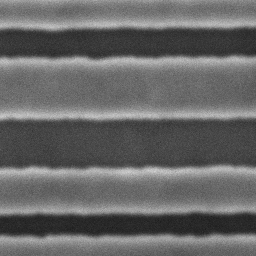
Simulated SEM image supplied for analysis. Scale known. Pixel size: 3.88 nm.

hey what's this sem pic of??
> lines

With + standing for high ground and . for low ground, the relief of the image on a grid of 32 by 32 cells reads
++++++++++++++++++++++++++++++++
++++++++++++++++++++++++++++++++
++++++++++++++++++++++++++++++++
....+++++.......................
................................
................................
................................
++++++.++++..+++++++++++++++++++
++++++++++++++++++++++++++++++++
++++++++++++++++++++++++++++++++
++++++++++++++++++++++++++++++++
++++++++++++++++++++++++++++++++
++++++++++++++++++++++++++++++++
++++++++++++++++++++++++++++++++
++++++++++++++++++++++++++++++++
................................
................................
................................
................................
................................
................................
++++++++++++++++++++++++++++++++
++++++++++++++++++++++++++++++++
++++++++++++++++++++++++++++++++
++++++++++++++++++++++++++++++++
++++++++++++++++++++++++++++++++
++++++++++++++++++++++++.+++++..
................................
................................
........+...........++....++.+++
++++++++++++++++++++++++++++++++
++++++++++++++++++++++++++++++++